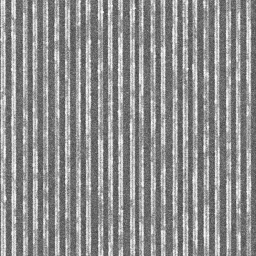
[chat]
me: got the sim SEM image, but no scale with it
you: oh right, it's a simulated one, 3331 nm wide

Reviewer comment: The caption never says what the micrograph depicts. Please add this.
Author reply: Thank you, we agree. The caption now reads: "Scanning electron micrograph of parallel lines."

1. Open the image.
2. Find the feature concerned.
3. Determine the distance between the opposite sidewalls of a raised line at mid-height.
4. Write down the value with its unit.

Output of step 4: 50.4 nm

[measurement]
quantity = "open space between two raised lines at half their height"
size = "87.8 nm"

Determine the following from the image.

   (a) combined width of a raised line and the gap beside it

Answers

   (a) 139 nm